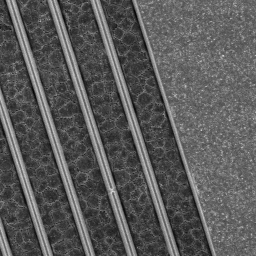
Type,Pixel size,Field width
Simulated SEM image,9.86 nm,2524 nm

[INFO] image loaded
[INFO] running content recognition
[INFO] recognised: parallel lines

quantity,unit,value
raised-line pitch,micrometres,0.397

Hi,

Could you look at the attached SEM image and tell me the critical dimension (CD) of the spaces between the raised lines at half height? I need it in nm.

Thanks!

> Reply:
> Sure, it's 341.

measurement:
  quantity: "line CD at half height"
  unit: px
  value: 5.96